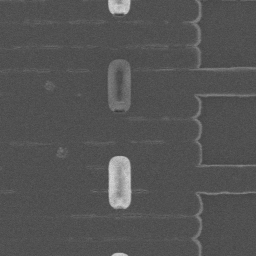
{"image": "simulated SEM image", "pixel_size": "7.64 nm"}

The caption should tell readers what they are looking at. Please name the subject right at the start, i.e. wiring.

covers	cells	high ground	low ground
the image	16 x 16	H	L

HHHHHHHHHHHHHLLL
HHHHHHHHHHHHLLLL
HHHHHHHHHHHHLLLL
HHHHHHHHHHHHLLLL
HHHHHHHHHHHHHHHH
HHHHHHHHHHHHHHHH
HHHHHHHHHHHHHLLL
HHHHHHHHHHHHLLLL
HHHHHHHHHHHHLLLL
HHHHHHHHHHHHHLLL
HHHHHHHHHHHHHHHH
HHHHHHHHHHHHHHHH
HHHHHHHHHHHHHLLL
HHHHHHHHHHHHHLLL
HHHHHHHHHHHHLLLL
HHHHHHHHHHHHLLLL